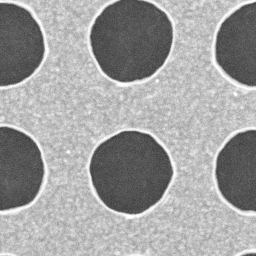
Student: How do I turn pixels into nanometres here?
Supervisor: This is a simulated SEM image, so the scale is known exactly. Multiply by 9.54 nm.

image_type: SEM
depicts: holes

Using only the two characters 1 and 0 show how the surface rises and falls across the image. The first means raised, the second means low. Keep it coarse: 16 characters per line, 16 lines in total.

0011111000111110
0011110000011100
0001110000011000
0001110000111000
0011110000111100
1111111111111111
1111111111111111
1111111111111111
0011111001111110
0001110000111100
0001110000011000
0001110000011100
0011110000111100
1111111111111111
1111111111111111
1111111111111111